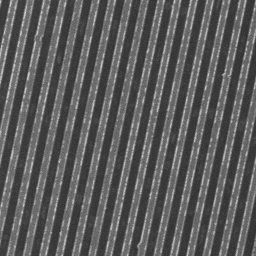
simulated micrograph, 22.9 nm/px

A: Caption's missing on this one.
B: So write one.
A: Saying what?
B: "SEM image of parallel lines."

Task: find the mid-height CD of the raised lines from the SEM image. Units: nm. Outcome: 151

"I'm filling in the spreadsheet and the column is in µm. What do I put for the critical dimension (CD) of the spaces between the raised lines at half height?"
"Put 0.216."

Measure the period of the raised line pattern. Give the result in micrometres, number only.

0.366